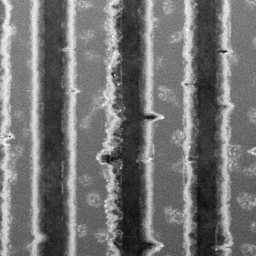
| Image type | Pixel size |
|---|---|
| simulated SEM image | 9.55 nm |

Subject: one or a few lines or trenches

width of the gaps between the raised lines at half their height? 344 nm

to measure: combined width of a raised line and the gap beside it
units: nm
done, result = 708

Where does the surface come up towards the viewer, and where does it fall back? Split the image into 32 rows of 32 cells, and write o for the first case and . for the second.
.ooo.....ooooo.....ooooo....oooo
.ooo.....ooooo.....ooooo....oooo
.ooo.....ooooo.....ooooo....oooo
.ooo.....ooooo.....ooooo....oooo
.ooo.....ooooo.....ooooo....oooo
.ooo.....ooooo.....ooooo....oooo
.ooo.....ooooo.....ooooo....oooo
.ooo.....ooooo.....ooooo....oooo
.ooo.....ooooo.....ooooo....oooo
.ooo.....ooooo.....ooooo....oooo
.ooo.....ooooo.....oooo.....oooo
.ooo.....ooooo.....ooooo....oooo
.ooo.....ooooo.....oooo.....oooo
.ooo.....ooooo....oooooo.....ooo
.ooo.....ooooo.....ooooo....oooo
.ooo.....ooooo.....ooooo....oooo
oooo.....ooooo.....ooooo....oooo
oooo.....ooooo....oooooo....oooo
.ooo.....ooooo....ooooo.....oooo
.ooo.....oooo.....ooooo.....oooo
.ooo.....oooo.....oooooo....oooo
.ooo.....ooooo....oooooo....oooo
.ooo.....ooooo.....ooooo....oooo
.ooo.....ooooo.....oooo.....oooo
.ooo.....ooooo.....ooooo....oooo
.ooo.....ooooo.....ooooo....oooo
.ooo.....ooooo.....ooooo....oooo
.ooo.....ooooo....oooooo....oooo
.ooo.....ooooo....oooooo....oooo
.oooo....ooooo.....oooo.....oooo
.ooo.....ooooo......oooo....oooo
.ooo.....oooooo....ooooo....oooo